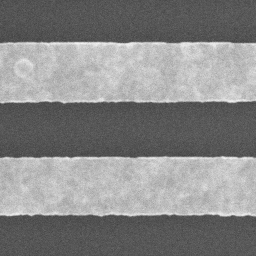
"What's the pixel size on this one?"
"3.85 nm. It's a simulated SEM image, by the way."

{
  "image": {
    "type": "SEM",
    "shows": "lines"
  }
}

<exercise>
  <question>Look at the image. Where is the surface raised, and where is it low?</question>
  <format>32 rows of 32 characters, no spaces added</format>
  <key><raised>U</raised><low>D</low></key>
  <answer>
DDDDDDDDDDDDDDDDDDDDDDDDDDDDDDDD
DDDDDDDDDDDDDDDDDDDDDDDDDDDDDDDD
DDDDDDDDDDDDDDDDDDDDDDDDDDDDDDDD
DDDDDDDDDDDDDDDDDDDDDDDDDDDDDDDD
DDDDDDDDDDDDDDDDDDDDDDDDDDDDDDDD
UUUUUUUUUUUUUUUUUUUUUUUUUUUUUUUU
UUUUUUUUUUUUUUUUUUUUUUUUUUUUUUUU
UUUUUUUUUUUUUUUUUUUUUUUUUUUUUUUU
UUUUUUUUUUUUUUUUUUUUUUUUUUUUUUUU
UUUUUUUUUUUUUUUUUUUUUUUUUUUUUUUU
UUUUUUUUUUUUUUUUUUUUUUUUUUUUUUUU
UUUUUUUUUUUUUUUUUUUUUUUUUUUUUUUU
UUUUUUUUUUUUUUUUUUUUUUUUUUUUUUUU
DDDDDDDDDDDDDDDDDDDDDDDDDDDDDDDD
DDDDDDDDDDDDDDDDDDDDDDDDDDDDDDDD
DDDDDDDDDDDDDDDDDDDDDDDDDDDDDDDD
DDDDDDDDDDDDDDDDDDDDDDDDDDDDDDDD
DDDDDDDDDDDDDDDDDDDDDDDDDDDDDDDD
DDDDDDDDDDDDDDDDDDDDDDDDDDDDDDDD
DDDDDDDDDDDDDDDDDDDDDDDDDDDDDDDD
UUUUUUUUUUUUUUUUUUUUUUUUUUUUUUUU
UUUUUUUUUUUUUUUUUUUUUUUUUUUUUUUU
UUUUUUUUUUUUUUUUUUUUUUUUUUUUUUUU
UUUUUUUUUUUUUUUUUUUUUUUUUUUUUUUU
UUUUUUUUUUUUUUUUUUUUUUUUUUUUUUUU
UUUUUUUUUUUUUUUUUUUUUUUUUUUUUUUU
UUUUUUUUUUUUUUUUUUUUUUUUUUUUUUUU
DDDDDDDDDDDDDDDDDDDDDDDDDDDDDDDD
DDDDDDDDDDDDDDDDDDDDDDDDDDDDDDDD
DDDDDDDDDDDDDDDDDDDDDDDDDDDDDDDD
DDDDDDDDDDDDDDDDDDDDDDDDDDDDDDDD
DDDDDDDDDDDDDDDDDDDDDDDDDDDDDDDD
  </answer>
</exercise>